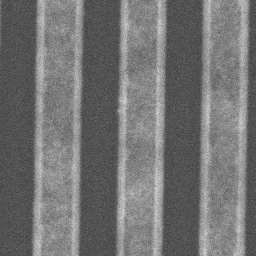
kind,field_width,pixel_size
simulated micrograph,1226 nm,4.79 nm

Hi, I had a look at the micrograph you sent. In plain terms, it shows one or a few lines or trenches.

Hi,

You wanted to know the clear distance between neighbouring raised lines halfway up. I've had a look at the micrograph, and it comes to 210 nanometres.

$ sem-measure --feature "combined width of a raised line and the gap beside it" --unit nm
397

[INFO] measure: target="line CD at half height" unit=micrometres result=0.183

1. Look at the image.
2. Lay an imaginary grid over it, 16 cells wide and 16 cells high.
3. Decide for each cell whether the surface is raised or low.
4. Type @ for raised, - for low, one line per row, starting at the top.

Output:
---@@---@@---@@-
---@@---@@---@@-
---@@---@@---@@-
---@@---@@---@@-
---@@---@@---@@-
--@@@---@@---@@-
--@@@---@@---@@-
--@@@---@@---@@-
--@@@---@@---@@-
--@@@---@@---@@-
--@@@---@@---@@-
--@@@---@@---@@-
--@@@---@@---@@-
--@@@---@@---@@-
--@@@---@@---@@-
--@@@---@@---@@-